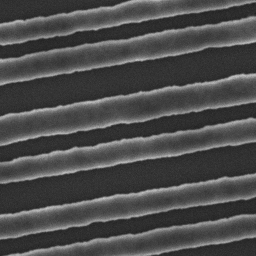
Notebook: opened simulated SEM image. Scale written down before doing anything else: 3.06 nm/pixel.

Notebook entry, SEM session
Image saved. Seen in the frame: lines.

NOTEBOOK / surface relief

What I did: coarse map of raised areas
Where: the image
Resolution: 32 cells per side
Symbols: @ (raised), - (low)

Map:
---------------@@@@@@@@@@@@@@@@-
---------@@@@@@@@@@@@@@@@-------
---@@@@@@@@@@@@@@@@-----------@@
@@@@@@@@@@@@@----------@@@@@@@@@
@@@@@@@@----------@@@@@@@@@@@@@@
@@----------@@@@@@@@@@@@@@@@@@@-
------@@@@@@@@@@@@@@@@@@--------
@@@@@@@@@@@@@@@@@@--------------
@@@@@@@@@@@@--------------------
@@@@@@-----------------------@@@
@-----------------------@@@@@@@@
------------------@@@@@@@@@@@@@@
------------@@@@@@@@@@@@@@@@@@@@
-------@@@@@@@@@@@@@@@@@@@@-----
@@@@@@@@@@@@@@@@@@@@@-----------
@@@@@@@@@@@@@@@-------------@@@@
@@@@@@@@@@------------@@@@@@@@@@
@@@------------@@@@@@@@@@@@@@@@@
---------@@@@@@@@@@@@@@@@@@-----
----@@@@@@@@@@@@@@@@@@----------
@@@@@@@@@@@@@@@-----------------
@@@@@@@@@-----------------------
@@@------------------------@@@@@
---------------------@@@@@@@@@@@
--------------@@@@@@@@@@@@@@@@@@
---------@@@@@@@@@@@@@@@@@@-----
---@@@@@@@@@@@@@@@@@------------
@@@@@@@@@@@@@@--------------@@@@
@@@@@@@@-------------@@@@@@@@@@@
@@@------------@@@@@@@@@@@@@@@@@
---------@@@@@@@@@@@@@@@@@@-----
---@@@@@@@@@@@@@@@@@@-----------